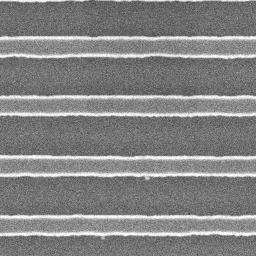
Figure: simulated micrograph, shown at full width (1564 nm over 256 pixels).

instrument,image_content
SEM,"lines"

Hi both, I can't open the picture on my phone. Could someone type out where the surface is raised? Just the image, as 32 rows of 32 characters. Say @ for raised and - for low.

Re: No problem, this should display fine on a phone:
--------------------------------
--------------------------------
--------------------------------
--------------------------------
--------------------------------
@@@@@@@@@@@@@@@@@@@@@@@@@@@@@@@@
@@@@@@@@@@@@@@@@@@@@@@@@@@@@@@@@
--------------------------------
--------------------------------
--------------------------------
--------------------------------
--------------------------------
@@@@@@@@@@@@@@@@@@@@@@@@@@@@@@@@
@@@@@@@@@@@@@@@@@@@@@@@@@@@@@@@@
--------------------------------
--------------------------------
--------------------------------
--------------------------------
--------------------------------
--------------------------------
@@@@@@@@@@@@@@@@@@@@@@@@@@@@@@@@
@@@@@@@@@@@@@@@@@@@@@@@@@@@@@@@@
--------------------------------
--------------------------------
--------------------------------
--------------------------------
--------------------------------
@@@@@@@@@@@@@@@@@@@@@@@@@@@@@@@@
@@@@@@@@@@@@@@@@@@@@@@@@@@@@@@@@
--------------------------------
--------------------------------
--------------------------------